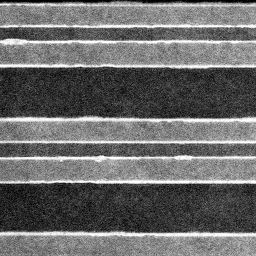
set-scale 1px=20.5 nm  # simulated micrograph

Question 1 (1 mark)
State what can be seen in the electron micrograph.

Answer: lines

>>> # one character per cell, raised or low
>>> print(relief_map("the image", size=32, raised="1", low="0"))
00000000000000000000000000000000
11111111111111111111111111111111
11111111111111111111111111111111
11111111111111111111111111111111
11111111111111111111111111111111
11111111111111111111111111111111
11111111111111111111111111111111
11111111111111111111111111111111
00000000000000000000000000000000
00000000000000000000000000000000
00000000000000000000000000000000
00000000000000000000000000000000
00000000000000000000000000000000
00000000000000000000000000000000
00000000000000000000000000000000
11111111111111111111111111111111
11111111111111111111111111111111
11111111111111111111111111111111
11111111111111111111111111111111
11111111111111111111111111111111
11111111111111111111111111111111
11111111111111111111111111111111
11111111111111111111111111111111
00000000000000000000000000000000
00000000000000000000000000000000
00000000000000000000000000000000
00000000000000000000000000000000
00000000000000000000000000000000
00000000000000000000000000000000
11111111111111111111111111111111
11111111111111111111111111111111
11111111111111111111111111111111